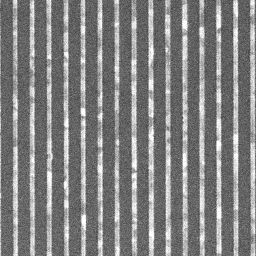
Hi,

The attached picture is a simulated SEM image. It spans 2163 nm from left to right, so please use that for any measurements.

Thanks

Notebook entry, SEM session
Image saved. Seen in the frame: parallel lines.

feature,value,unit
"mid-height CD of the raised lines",33.8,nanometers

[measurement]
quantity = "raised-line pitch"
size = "143 nm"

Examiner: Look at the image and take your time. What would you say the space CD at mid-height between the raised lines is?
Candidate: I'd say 110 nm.